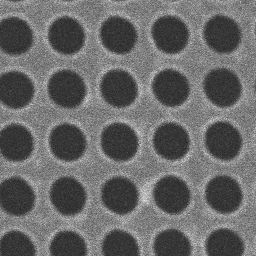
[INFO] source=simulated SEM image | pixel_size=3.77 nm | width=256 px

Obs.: a regular array of holes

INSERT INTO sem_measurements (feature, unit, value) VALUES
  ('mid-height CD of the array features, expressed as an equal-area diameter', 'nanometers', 148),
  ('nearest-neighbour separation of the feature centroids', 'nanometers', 196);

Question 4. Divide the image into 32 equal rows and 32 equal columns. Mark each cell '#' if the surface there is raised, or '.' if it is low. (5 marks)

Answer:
################################
################################
...####...###...###....###...###
....##....##.....##.....#.....##
....##.....#.....##.....#.....##
....##.....##....##....###....##
...####...####..####...####..###
################################
###########################.####
...###....###...###....###....##
....##.....#.....##.....#.....##
....##.....#.....##.....##....##
....##.....##....###...###....##
#..#####.######.################
################################
#.#####..#####..####..####...###
....##....###....##....###....##
....##.....#.....##.....##....##
....##.....##....##.....##....##
....###...###....###...####...##
################################
################################
...####...###...####...###...###
....##.....##....##.....##....##
....##.....##....##.....##....##
....##.....##....##.....##....##
#...###...####...###...####..###
################################
################################
....###...###....##....###....##
....##.....##....##.....##.....#
....##.....##.....#.....##.....#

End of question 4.